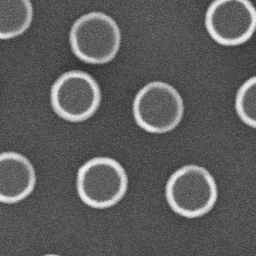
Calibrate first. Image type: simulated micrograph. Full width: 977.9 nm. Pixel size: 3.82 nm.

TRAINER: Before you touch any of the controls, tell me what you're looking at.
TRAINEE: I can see raised bodies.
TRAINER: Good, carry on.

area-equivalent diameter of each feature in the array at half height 186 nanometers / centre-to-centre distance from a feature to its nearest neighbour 317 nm